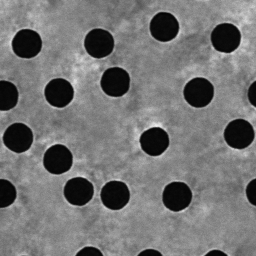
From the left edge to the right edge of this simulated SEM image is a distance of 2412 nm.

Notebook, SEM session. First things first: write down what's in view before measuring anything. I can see a regular array of holes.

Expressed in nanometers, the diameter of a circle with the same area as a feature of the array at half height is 280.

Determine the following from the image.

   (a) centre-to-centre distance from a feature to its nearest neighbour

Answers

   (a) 544 nanometers